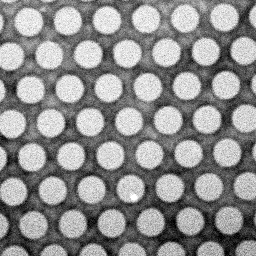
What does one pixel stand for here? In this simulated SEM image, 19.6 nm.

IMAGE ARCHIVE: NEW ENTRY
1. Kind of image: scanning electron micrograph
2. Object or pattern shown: an array of small figures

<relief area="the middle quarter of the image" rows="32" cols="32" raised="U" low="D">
DDDDDUUUDDDDDDDUUDDDDDDDDDDDDDDD
DDDDDDDDDDDDDDDDDDDDDDDDDDDDDDDD
DDDDDDDDDDDDDDDDDDDDDDDDDDDDDUUU
UUUDDDDDDUUUUDDDDDUUUUUDDDDDUUUU
UUUUDDDDUUUUUUDDDDUUUUUUDDDDUUUU
UUUUUDDDUUUUUUDDDDUUUUUUDDDUUUUU
UUUUUDDDUUUUUUDDDDUUUUUUDDDUUUUU
UUUUUDDDUUUUUUDDDDUUUUUUDDDDUUUU
UUUUDDDDDUUUUDDDDDDUUUUDDDDDDUUU
DDDDDDDDDDDDDDDDDDDDDDDDDDDDDDDD
DDDDDDDDDDDDDDDDDDDDDDDDDDDDDDDD
DDDDDUUUDDDDDDDUUUDDDDDDUUUUDDDD
DDDDUUUUUDDDDDUUUUUDDDDUUUUUUDDD
DDDUUUUUUUDDDUUUUUUDDDDUUUUUUDDD
DDDUUUUUUUDDDUUUUUUUDDDUUUUUUDDD
DDDUUUUUUUDDDUUUUUUDDDDUUUUUUDDD
DDDDUUUUUDDDDDUUUUUDDDDDUUUUDDDD
DDDDDUUUDDDDDDDUUDDDDDDDDDDDDDDD
DDDDDDDDDDDDDDDDDDDDDDDDDDDDDDDD
DDDDDDDDDDDDDDDDDDDDUUDDDDDDDDUU
UUUUDDDDDUUUUUDDDDDUUUUUDDDDDUUU
UUUUUDDDDUUUUUUDDDUUUUUUDDDDUUUU
UUUUUDDDUUUUUUUDDDUUUUUUUDDDUUUU
UUUUUDDDUUUUUUUDDDUUUUUUDDDDUUUU
UUUUUDDDDUUUUUUDDDDUUUUUDDDDDUUU
UUUUDDDDDDUUUUDDDDDDUUUDDDDDDDUU
DDDDDDDDDDDDDDDDDDDDDDDDDDDDDDDD
DDDDDDDDDDDDDDDDDDDDDDDDDDDDDDDD
DDDDDUUUDDDDDDDUUUUDDDDDUUUUDDDD
DDDDUUUUUUDDDDUUUUUUDDDUUUUUUDDD
DDDDUUUUUUDDDUUUUUUUDDDUUUUUUUDD
DDDDUUUUUUDDDUUUUUUUDDDUUUUUUUDD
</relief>